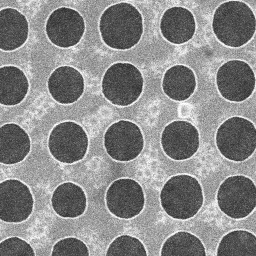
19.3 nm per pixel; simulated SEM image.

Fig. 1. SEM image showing a regular array of holes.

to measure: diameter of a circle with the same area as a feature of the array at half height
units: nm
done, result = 780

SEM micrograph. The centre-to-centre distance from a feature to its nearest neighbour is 1090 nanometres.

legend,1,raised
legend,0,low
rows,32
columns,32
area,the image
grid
11111111111111001111111111110001
00111110001110000111100011100000
00011100000100000011000011100000
00001100000100000011000011100000
00001100001110000011000011100000
00011110001110000111110111110001
11111111111111111111111111111111
11111111111111111111111111111011
00111110011111000111100011100001
00011100001110000011000011100000
00001100000110000011000001100000
00011100001110000011100011100000
00011110001110000111110111110001
11111111111111111111111111111111
11111111111111111111111111111111
10111110001111000111100011110000
00011100000110000011000001100000
00001100000110000011000001100000
00001100000110000011000001100000
00011110000111000111100011110001
00111111111111111111111111111111
11111111111111111111111111111111
10111111111111100111100001110001
00001110001111000011000001100000
00001100000110000011000001100000
00001100000110000011000001100000
00001110001111000011100001110001
00011111111111111111111111111111
11111111111111111111111111111111
11111111111111101111100011110000
00001110000111000011000001100000
00001100000110000011000000100000